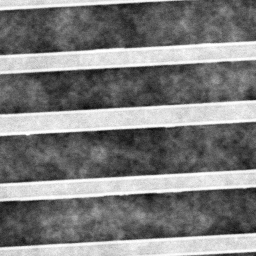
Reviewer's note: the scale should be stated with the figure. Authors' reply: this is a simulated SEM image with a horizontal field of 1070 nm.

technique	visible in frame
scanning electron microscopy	one or a few lines or trenches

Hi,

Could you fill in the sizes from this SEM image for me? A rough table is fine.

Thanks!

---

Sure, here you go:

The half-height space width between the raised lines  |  0.199 um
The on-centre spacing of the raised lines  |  267 nanometers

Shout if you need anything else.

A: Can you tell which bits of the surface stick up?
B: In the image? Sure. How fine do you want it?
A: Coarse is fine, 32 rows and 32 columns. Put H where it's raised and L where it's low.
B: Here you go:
HHHHHHHHHHLLLLLLLLLLLLLLLLLLLLLL
LLLLLLLLLLLLLLLLLLLLLLLLLLLLLLLL
LLLLLLLLLLLLLLLLLLLLLLLLLLLLLLLL
LLLLLLLLLLLLLLLLLLLLLLLLLLLLLLLL
LLLLLLLLLLLLLLLLLLLLLLLLLLLLLLLL
LLLLLLLLLLLLLLLLLLLLLLLLLLLLHHHH
LLLLLLLLLLLHHHHHHHHHHHHHHHHHHHHH
HHHHHHHHHHHHHHHHHHHHHHHHHHHHHLLL
HHHHHHHHHHHLLLLLLLLLLLLLLLLLLLLL
LLLLLLLLLLLLLLLLLLLLLLLLLLLLLLLL
LLLLLLLLLLLLLLLLLLLLLLLLLLLLLLLL
LLLLLLLLLLLLLLLLLLLLLLLLLLLLLLLL
LLLLLLLLLLLLLLLLLLLLLLLLLLLLLLLL
LLLLLLLLLLLLLLLLLHHHHHHHHHHHHHHH
HHHHHHHHHHHHHHHHHHHHHHHHHHHHHHHH
HHHHHHHHHHHHHHHHHHHHHHHHLLLLLLLL
HHHHHHLLLLLLLLLLLLLLLLLLLLLLLLLL
LLLLLLLLLLLLLLLLLLLLLLLLLLLLLLLL
LLLLLLLLLLLLLLLLLLLLLLLLLLLLLLLL
LLLLLLLLLLLLLLLLLLLLLLLLLLLLLLLL
LLLLLLLLLLLLLLLLLLLLLLLLLLLLLLLL
LLLLLLLLLLLLLLLLLLLLLLLLLLLLLHHH
LLLLLLLLLLLHHHHHHHHHHHHHHHHHHHHH
HHHHHHHHHHHHHHHHHHHHHHHHHHHLLLLL
HHHHHHHHHLLLLLLLLLLLLLLLLLLLLLLL
LLLLLLLLLLLLLLLLLLLLLLLLLLLLLLLL
LLLLLLLLLLLLLLLLLLLLLLLLLLLLLLLL
LLLLLLLLLLLLLLLLLLLLLLLLLLLLLLLL
LLLLLLLLLLLLLLLLLLLLLLLLLLLLLLLL
LLLLLLLLLLLLLLLLLLLLLLLLLLLLHHHH
LLLLLLLLLLHHHHHHHHHHHHHHHHHHHHHH
HHHHHHHHHHHHHHHHHHHHHHHHHHHHHLLL